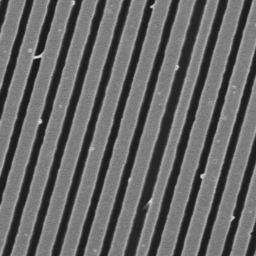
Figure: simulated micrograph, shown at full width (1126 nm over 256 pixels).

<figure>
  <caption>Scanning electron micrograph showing parallel lines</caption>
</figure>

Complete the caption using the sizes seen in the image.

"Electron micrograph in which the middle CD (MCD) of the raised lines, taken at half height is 71.9 nm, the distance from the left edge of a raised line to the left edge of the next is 23.4 pixels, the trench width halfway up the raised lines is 0.0296 um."